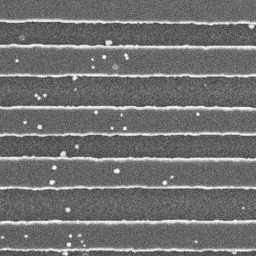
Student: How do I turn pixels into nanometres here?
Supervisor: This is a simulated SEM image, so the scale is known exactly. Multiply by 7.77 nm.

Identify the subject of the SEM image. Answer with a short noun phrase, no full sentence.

lines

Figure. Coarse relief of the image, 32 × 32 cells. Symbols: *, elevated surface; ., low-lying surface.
********************************
********************************
********************************
................................
................................
................................
********************************
********************************
********************************
....****.......****.....**..***.
................................
................................
................................
*******************************.
********************************
********************************
********************************
................................
................................
................................
********************************
********************************
********************************
*..******..**............***..**
................................
................................
................................
................................
********************************
********************************
********************************
................................